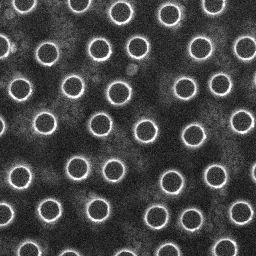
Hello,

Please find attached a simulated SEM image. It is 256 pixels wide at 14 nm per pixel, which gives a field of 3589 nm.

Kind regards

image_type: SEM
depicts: a regular array of holes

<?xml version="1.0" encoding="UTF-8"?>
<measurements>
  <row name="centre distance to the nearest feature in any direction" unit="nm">582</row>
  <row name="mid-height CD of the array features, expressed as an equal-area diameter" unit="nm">275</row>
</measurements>